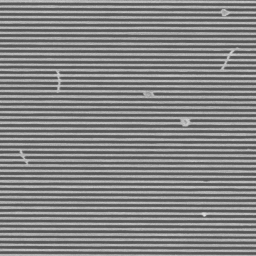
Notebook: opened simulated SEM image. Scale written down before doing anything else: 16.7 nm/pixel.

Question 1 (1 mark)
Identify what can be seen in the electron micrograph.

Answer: parallel lines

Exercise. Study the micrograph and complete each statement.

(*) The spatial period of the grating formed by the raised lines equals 88.2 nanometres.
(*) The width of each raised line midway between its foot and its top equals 41.6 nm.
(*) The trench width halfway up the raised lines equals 43.7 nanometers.